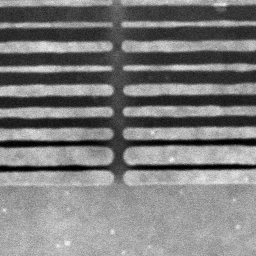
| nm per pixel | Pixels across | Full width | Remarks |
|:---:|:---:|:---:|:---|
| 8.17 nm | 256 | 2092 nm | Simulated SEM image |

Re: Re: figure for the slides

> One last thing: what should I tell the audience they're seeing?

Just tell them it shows groups of lines, slits or small figures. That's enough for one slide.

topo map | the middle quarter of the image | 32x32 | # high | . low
...........................#####
##########......................
................................
................................
................................
###########......###############
############...#################
############....########........
................................
................................
................................
############...#################
############...#################
................................
................................
................................
############...#################
############...#################
############...#################
................................
..........................###...
############....################
############...#################
############...#################
############...#################
................................
................................
############...#################
############...#################
############...#################
................................
................................